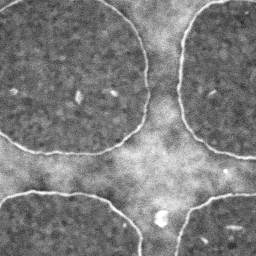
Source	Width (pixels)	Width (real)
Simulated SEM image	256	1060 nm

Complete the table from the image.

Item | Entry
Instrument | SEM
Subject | raised bodies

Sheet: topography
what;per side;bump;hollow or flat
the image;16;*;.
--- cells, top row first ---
*******......***
********....****
*********..*****
*********..*****
*********..*****
*********..*****
*********..*****
*********...****
********....****
..*****.......**
................
................
*******......***
********....****
*********..*****
*********..*****